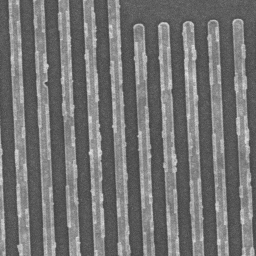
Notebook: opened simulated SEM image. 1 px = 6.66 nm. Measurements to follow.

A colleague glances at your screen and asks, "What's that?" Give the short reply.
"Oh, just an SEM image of parallel lines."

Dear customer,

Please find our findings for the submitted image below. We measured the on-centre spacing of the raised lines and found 165 nm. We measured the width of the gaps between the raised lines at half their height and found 0.094 µm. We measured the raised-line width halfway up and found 70.7 nanometers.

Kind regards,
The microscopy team